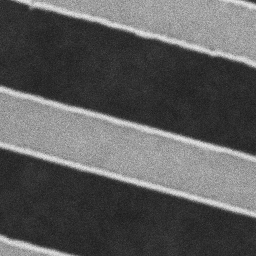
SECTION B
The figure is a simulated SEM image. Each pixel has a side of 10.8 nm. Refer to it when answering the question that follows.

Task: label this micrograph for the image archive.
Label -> one or a few lines or trenches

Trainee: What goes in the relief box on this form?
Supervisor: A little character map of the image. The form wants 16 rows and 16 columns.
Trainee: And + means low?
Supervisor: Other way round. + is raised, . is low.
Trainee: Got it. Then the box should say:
+++.............
+++++++.........
+++++++++++.....
++++++++++++++..
++++++++++++++++
++++++++++++++++
...+++++++++++++
.......+++++++++
...........+++++
++............++
+++++...........
+++++++++.......
+++++++++++++...
++++++++++++++++
++++++++++++++++
..++++++++++++++